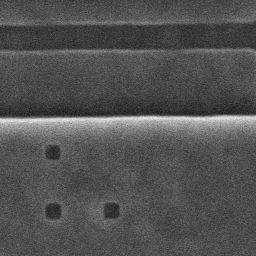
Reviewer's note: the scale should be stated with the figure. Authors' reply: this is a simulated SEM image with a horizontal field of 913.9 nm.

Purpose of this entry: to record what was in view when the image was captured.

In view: wiring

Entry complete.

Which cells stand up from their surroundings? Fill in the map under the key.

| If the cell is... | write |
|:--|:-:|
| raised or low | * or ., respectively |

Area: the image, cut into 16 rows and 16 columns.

................
................
................
................
................
................
................
****************
****************
****************
****************
****************
****************
****************
****************
****************